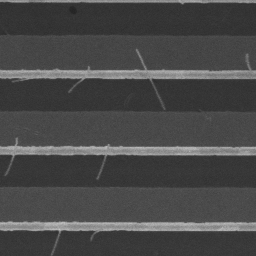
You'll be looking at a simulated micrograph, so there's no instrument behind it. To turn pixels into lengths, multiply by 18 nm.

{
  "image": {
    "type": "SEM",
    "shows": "lines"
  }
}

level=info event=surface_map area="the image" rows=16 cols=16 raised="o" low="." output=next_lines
................
................
oooooooooooooooo
oooooooooooooooo
oooooooooooooooo
................
................
oooooooooooooooo
oooooooooooooooo
oooooooooooooooo
................
................
oooooooooooooooo
oooooooooooooooo
................
................